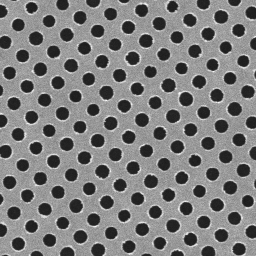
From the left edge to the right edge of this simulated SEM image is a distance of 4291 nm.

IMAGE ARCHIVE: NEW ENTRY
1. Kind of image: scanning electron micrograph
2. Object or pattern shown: a regular array of holes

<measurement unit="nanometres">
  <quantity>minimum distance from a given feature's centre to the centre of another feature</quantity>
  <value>362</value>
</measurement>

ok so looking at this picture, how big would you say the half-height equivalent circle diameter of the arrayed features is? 223 nm